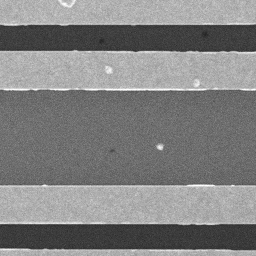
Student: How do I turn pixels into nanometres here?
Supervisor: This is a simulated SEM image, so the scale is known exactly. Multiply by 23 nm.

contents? lines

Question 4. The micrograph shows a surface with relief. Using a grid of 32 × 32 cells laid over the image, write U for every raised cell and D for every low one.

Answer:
UUUUUUUUUUUUUUUUUUUUUUUUUUUUUUUU
UUUUUUUUUUUUUUUUUUUUUUUUUUUUUUUU
UUUUUUUUUUUUUUUUUUUUUUUUUUUUUUUU
DDDDDDDDDDDDDDDDDDDDDDDDDDDDDDDD
DDDDDDDDDDDDDDDDDDDDDDDDDDDDDDDD
DDDDDDDDDDDDDDDDDDDDDDDDDDDDDDDD
UUUUUUUUUUUUUUUUUUUUUUDUDDDDDUDD
UUUUUUUUUUUUUUUUUUUUUUUUUUUUUUUU
UUUUUUUUUUUUUUUUUUUUUUUUUUUUUUUU
UUUUUUUUUUUUUUUUUUUUUUUUUUUUUUUU
UUUUUUUUUUUUUUUUUUUUUUUUUUUUUUUU
DDDDDDDDDDDDDDDDDDDDDDDDDDDDDDDD
DDDDDDDDDDDDDDDDDDDDDDDDDDDDDDDD
DDDDDDDDDDDDDDDDDDDDDDDDDDDDDDDD
DDDDDDDDDDDDDDDDDDDDDDDDDDDDDDDD
DDDDDDDDDDDDDDDDDDDDDDDDDDDDDDDD
DDDDDDDDDDDDDDDDDDDDDDDDDDDDDDDD
DDDDDDDDDDDDDDDDDDDDDDDDDDDDDDDD
DDDDDDDDDDDDDDDDDDDDDDDDDDDDDDDD
DDDDDDDDDDDDDDDDDDDDDDDDDDDDDDDD
DDDDDDDDDDDDDDDDDDDDDDDDDDDDDDDD
DDDDDDDDDDDDDDDDDDDDDDDDDDDDDDDD
DDDDDDDDDDDDDDDDDDDDDDDDDDDDDDDD
UUUUUUUUUUUUUUUUUUUUUUUUUUUUUUUU
UUUUUUUUUUUUUUUUUUUUUUUUUUUUUUUU
UUUUUUUUUUUUUUUUUUUUUUUUUUUUUUUU
UUUUUUUUUUUUUUUUUUUUUUUUUUUUUUUU
UUUUUUUUUUUUUUUUUUUUUUUUUUUUUUUU
DDDDDDDDDDDDDDDDDDDDDDDDDDDDDDDD
DDDDDDDDDDDDDDDDDDDDDDDDDDDDDDDD
DDDDDDDDDDDDDDDDDDDDDDDDDDDDDDDD
UUUUUUUUUUUUUUUUUUUUUUUUUUUUUUUU